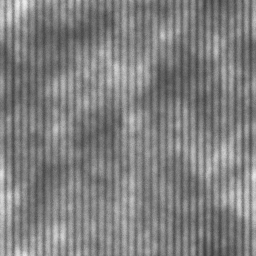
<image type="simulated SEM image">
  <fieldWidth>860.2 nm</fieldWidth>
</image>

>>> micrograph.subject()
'parallel lines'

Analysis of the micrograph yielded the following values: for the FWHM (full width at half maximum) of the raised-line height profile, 17.2 nanometers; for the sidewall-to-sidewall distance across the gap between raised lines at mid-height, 2.5 pixels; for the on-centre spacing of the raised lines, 25.7 nanometers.